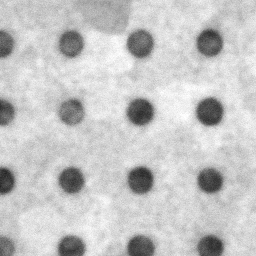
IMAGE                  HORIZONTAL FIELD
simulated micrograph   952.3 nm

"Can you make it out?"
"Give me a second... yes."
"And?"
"a regular array of holes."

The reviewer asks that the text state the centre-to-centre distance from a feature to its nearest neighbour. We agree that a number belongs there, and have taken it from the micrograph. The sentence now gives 254 nm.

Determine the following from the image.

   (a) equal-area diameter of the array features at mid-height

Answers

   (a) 27.8 px